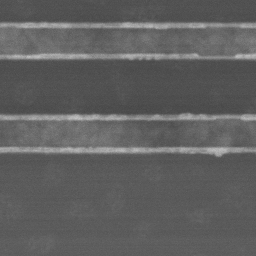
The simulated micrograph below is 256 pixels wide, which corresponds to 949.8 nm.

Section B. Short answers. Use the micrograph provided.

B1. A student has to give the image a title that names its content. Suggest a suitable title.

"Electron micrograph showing one or a few lines or trenches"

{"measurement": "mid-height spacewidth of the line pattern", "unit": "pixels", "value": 57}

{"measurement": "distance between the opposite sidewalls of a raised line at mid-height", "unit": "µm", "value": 0.131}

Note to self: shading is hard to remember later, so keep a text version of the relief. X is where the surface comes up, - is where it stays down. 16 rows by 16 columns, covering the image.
----------------
-XX----XX-------
XXXXXXXXXXXXXXXX
XXXXXXXXXXXXXXXX
----------------
----------------
----------------
XXXXXXXXXXXXXXXX
XXXXXXXXXXXXXXXX
------------XX--
----------------
----------------
----------------
----------------
----------------
----------------